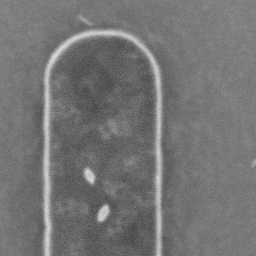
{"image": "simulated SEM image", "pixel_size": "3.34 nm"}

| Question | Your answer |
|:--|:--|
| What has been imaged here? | one or a few lines or trenches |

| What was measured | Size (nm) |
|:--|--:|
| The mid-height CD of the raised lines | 375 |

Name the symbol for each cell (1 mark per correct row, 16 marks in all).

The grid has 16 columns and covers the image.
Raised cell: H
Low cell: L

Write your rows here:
LLLLLLLLLLLLLLLL
LLLLLLLLLLLLLLLL
LLLLLHHHLLLLLLLL
LLLHHHHHHLLLLLLL
LLLHHHHHHHLLLLLL
LLLHHHHHHHLLLLLL
LLLHHHHHHHLLLLLL
LLLHHHHHHHLLLLLL
LLLHHHHHHHLLLLLL
LLLHHHHHHHLLLLLL
LLLHHHHHHHLLLLLL
LLLHHHHHHHLLLLLL
LLLHHHHHHHLLLLLL
LLLHHHHHHHLLLLLL
LLLHHHHHHHLLLLLL
LLLHHHHHHHLLLLLL